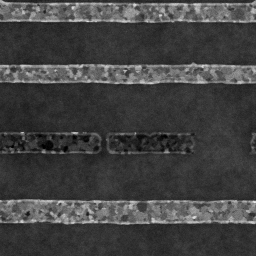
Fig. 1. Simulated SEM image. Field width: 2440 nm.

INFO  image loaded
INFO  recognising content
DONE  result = one or a few lines or trenches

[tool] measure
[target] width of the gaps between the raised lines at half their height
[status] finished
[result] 463 nm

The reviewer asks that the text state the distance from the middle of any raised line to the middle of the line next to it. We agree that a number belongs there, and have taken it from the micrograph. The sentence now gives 634 nanometers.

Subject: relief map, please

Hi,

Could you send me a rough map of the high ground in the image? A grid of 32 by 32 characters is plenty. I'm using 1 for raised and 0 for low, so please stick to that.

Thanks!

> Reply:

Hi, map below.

11110001111110100000000000000001
11111111111111111111111111111111
11111111111000111111110111111111
00000000000000000000000000000000
00000000000000000000000000000000
00000000000000000000000000000000
00000000000000000000000000000000
00000000000000000000000000000000
11111111111111111111111111111111
11111111111111111111111111111111
00000000000000000000000000000000
00000000000000000000000000000000
00000000000000000000000000000000
00000000000000000000000000000000
00000000000000000000000000000000
00000000000000000000000000000000
00000000000000000000000000000000
11111111111101111111111100000000
11111111111100111111111100000000
00000000000000000000000000000000
00000000000000000000000000000000
00000000000000000000000000000000
00000000000000000000000000000000
00000000000000000000000000000000
00000000000000000000000000000000
11111111111111111111111111111111
11111111111111111111111111111111
11111111111111111111111111111111
00000000000000000000000000000000
00000000000000000000000000000000
00000000000000000000000000000000
00000000000000000000000000000000